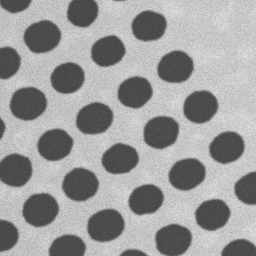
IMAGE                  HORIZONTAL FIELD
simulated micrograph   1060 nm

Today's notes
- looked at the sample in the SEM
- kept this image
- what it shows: a regular array of holes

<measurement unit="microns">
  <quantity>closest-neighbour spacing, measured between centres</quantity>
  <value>0.197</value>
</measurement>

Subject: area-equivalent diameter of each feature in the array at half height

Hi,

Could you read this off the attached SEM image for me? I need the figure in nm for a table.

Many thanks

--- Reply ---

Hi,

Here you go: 139